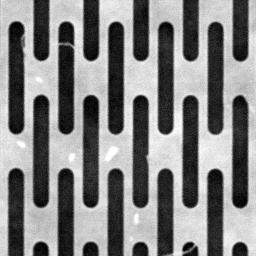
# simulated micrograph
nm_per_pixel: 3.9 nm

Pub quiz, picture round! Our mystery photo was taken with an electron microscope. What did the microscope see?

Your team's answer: groups of lines, slits or small figures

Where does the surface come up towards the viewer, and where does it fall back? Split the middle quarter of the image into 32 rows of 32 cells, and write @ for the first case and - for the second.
---@@@@@@@@----@@@@@@@@-----@@@@
---@@@@@@@@----@@@@@@@@----@@@@@
---@@@@@@@@----@@@@@@@@----@@@@@
---@@@@@@@@----@@@@@@@@----@@@@@
---@@@@@@@@----@@@@@@@@----@@@@@
---@@@@@@@@----@@@@@@@@----@@@@@
---@@@@@@@@----@@@@@@@@----@@@@@
---@@@@@@@@----@@@@@@@@----@@@@@
---@@---@@@----@@@---@@----@@@--
---@@----@@----@@----@@----@@@--
---@@----@@----@@----@@----@@---
---@@----@@----@@----@@----@@---
---@@----@@----@@----@@----@@---
---@@----@@----@@----@@----@@---
---@@----@@----@@----@@----@@---
---@@----@@----@@----@@----@@---
--@@@----@@----@@----@@@---@@---
-@@@@----@@@--@@@----@@@---@@---
@@@@@----@@@@@@@@----@@@@@@@@---
@@@@@----@@@@@@@@----@@@@@@@@---
@@@@@----@@@@@@@@----@@@@@@@@---
@@@@@----@@@@@@@@----@@@@@@@@---
@@@@@----@@@@@@@@----@@@@@@@@---
@@@@@----@@@@@@@@----@@@@@@@@---
@@@@@----@@@@@@@@----@@@@@@@@---
@@@@@----@@@@@@@@----@@@@@@@@---
--@@@----@@@--@@@----@@@---@@---
--@@@----@@----@@----@@----@@---
---@@----@@----@@----@@----@@---
---@@----@@----@@----@@----@@---
---@@----@@----@@----@@----@@---
---@@----@@----@@----@@----@@---